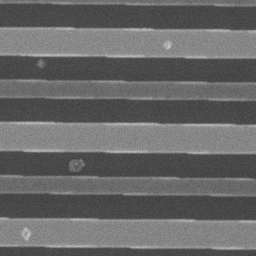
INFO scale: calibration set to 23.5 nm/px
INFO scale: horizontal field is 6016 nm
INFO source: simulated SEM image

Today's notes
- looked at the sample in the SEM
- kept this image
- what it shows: lines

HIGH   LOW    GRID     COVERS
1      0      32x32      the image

00000000000000001111111111111111
00000000000000000000000000000000
00000000000000000000000000000000
00000000000000000000000000000000
11111111111111111111111111111111
11111111111111111111111111111111
11111111111111111111111111111111
00000000000000000000000000000000
00000000000000000000000000000000
00000000000000000000000000000000
11111111111111111111111111111111
11111111111111111111111111111111
00000000000000000000000000011111
00000000000000000000000000000000
00000000000000000000000000000000
11111111111111110110000000000000
11111111111111111111111111111111
11111111111111111111111111111111
11111111111111111111111111111111
00000000000000000000000000000000
00000000000000000000000000000000
00000000000000000000000000000000
11111111111111111111111111111111
11111111111111111111111111111111
00000000000000000000000000000000
00000000000000000000000000000000
00000000000000000000000000000000
11111111111000000000000000000000
11111111111111111111111111111111
11111111111111111111111111111111
11111111111111111111111111111111
00000000000000000000000000000000